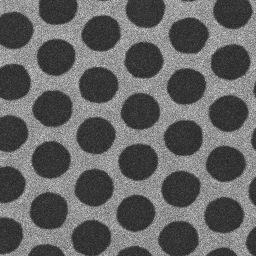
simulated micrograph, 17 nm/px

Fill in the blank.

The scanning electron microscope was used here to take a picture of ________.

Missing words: a regular array of holes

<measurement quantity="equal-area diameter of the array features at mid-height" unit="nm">644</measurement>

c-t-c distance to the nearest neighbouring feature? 0.845 um